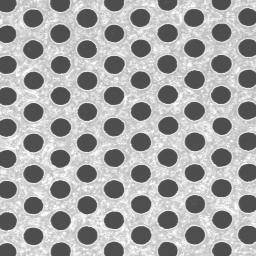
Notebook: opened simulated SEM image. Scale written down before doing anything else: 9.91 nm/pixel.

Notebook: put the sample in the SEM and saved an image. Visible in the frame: a regular array of holes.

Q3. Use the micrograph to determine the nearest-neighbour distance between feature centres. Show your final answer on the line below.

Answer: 304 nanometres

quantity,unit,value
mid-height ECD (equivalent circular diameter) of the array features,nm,192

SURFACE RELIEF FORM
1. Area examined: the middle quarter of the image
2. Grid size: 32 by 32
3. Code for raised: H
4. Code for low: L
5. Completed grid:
LLHHHHHHHHLLLLLHHHHHHHHLLLLLHHHH
LHHHHHHHHHLLLLLHHHHHHHHHLLLLHHHH
HHHHLLLHHHHHHHHHHLLLLHHHHHHHHHHL
HHHLLLLLHHHHHHHHHLLLLLHHHHHHHHLL
HHHLLLLLHHHHHHHHHLLLLLHHHHHHHHLL
HHHHLLLLHHHHHHHHHLLLLHHHHLLHHHHL
LHHHHLHHHHHLLLHHHHHHHHHHLLLLHHHH
LLHHHHHHHHLLLLLHHHHHHHHLLLLLLHHH
LLHHHHHHHHLLLLLHHHHHHHHHLLLLHHHH
LHHHHHHHHHHLLLHHHHHHHHHHHLLLHHHH
HHHHLLLLHHHHHHHHHLLLLHHHHHHHHHHL
HHHLLLLLHHHHHHHHHLLLLLHHHHHHHHLL
HHHLLLLLHHHHHHHHHLLLLLHHHHHHHHLL
HHHHLLLLHHHLLHHHHLLLLHHHHLLLHHHL
LHHHHHHHHHLLLLLHHHHHHHHHLLLLHHHH
LLHHHHHHHHLLLLLHHHHHHHHLLLLLLHHH
LLHHHHHHHHLLLLLHHHHHHHHHLLLLHHHH
LHHHHLHHHHHLLLHHHHLLLHHHHLLHHHHL
HHHHLLLLHHHHHHHHHLLLLHHHHHHHHHLL
HHHLLLLLHHHHHHHHHLLLLLHHHHHHHHLL
HHHLLLLLHHHHHHHHHLLLLLHHHHHHHHLL
HHHHLLLHHHHLLLHHHHLLLHHHHLLHHHHL
LHHHHHHHHHLLLLLHHHHHHHHHLLLLHHHH
LLHHHHHHHHLLLLLHHHHHHHHLLLLLHHHH
LHHHHHHHHHLLLLLHHHHHHHHHLLLLHHHH
HHHHLLLHHHHLLLHHHHLLLHHHHLLHHHHL
HHHLLLLLHHHHHHHHHLLLLLHHHHHHHHLL
HHHLLLLLHHHHHHHHHLLLLLHHHHHHHHLL
HHHHLLLLHHHHHHHHHLLLLHHHHHHHHHHL
LHHHHLLHHHHLLLHHHHLLHHHHLLLLHHHH
LHHHHHHHHHLLLLLHHHHHHHHHLLLLHHHH
LLHHHHHHHHLLLLLHHHHHHHHLLLLLLHHH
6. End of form